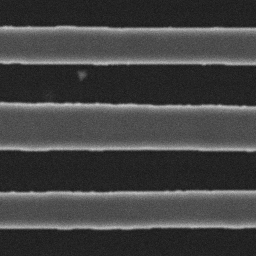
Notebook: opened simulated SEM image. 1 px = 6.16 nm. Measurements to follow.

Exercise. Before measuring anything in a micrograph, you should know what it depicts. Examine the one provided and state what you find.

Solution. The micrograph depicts lines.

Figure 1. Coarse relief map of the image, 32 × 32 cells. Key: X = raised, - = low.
--------------------------------
--------------------------------
--------------------------------
XXXXXXXXXXXXXX------------X-----
XXXXXXXXXXXXXXXXXXXXXXXXXXXXXXXX
XXXXXXXXXXXXXXXXXXXXXXXXXXXXXXXX
XXXXXXXXXXXXXXXXXXXXXXXXXXXXXXXX
XXXXXXXXXXXXXXXXXXXXXXXXXXXXXXXX
--------------------------------
--------------------------------
--------------------------------
--------------------------------
--------------------------------
XXXXXXXXXXXXXXXXXXXXXXXXXXXXXXXX
XXXXXXXXXXXXXXXXXXXXXXXXXXXXXXXX
XXXXXXXXXXXXXXXXXXXXXXXXXXXXXXXX
XXXXXXXXXXXXXXXXXXXXXXXXXXXXXXXX
XXXXXXXXXXXXXXXXXXXXXXXXXXXXXXXX
XXXXXXXXXXXXXXXXXXXXXXXXXXXXXXXX
--------------------------------
--------------------------------
--------------------------------
--------------------------------
--------------------------------
XXXXXXXXXXXXXXXXXXXXXXXXXXXXXXXX
XXXXXXXXXXXXXXXXXXXXXXXXXXXXXXXX
XXXXXXXXXXXXXXXXXXXXXXXXXXXXXXXX
XXXXXXXXXXXXXXXXXXXXXXXXXXXXXXXX
XXXXXXXXXXXXXXXXXXX-X-------XXX-
--------------------------------
--------------------------------
--------------------------------